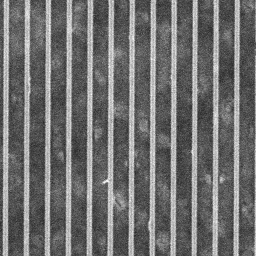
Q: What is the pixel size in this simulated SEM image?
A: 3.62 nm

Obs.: parallel lines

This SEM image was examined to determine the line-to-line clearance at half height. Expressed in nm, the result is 60.6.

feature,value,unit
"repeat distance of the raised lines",75.9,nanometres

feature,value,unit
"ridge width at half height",16.7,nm